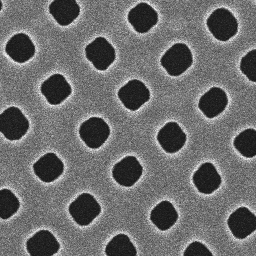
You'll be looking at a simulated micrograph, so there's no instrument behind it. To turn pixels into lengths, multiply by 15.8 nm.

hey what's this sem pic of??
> a regular array of holes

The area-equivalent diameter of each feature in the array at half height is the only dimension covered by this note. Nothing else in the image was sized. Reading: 461 nm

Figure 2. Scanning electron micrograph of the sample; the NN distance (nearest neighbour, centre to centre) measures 853 nm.